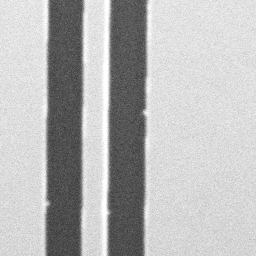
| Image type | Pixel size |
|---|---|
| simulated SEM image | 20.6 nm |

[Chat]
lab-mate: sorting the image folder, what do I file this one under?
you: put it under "lines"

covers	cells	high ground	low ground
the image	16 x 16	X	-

XXX--XX--XXXXXXX
XXX--XX--XXXXXXX
XXX--XX--XXXXXXX
XXX--XX--XXXXXXX
XXX--XX--XXXXXXX
XXX--XX--XXXXXXX
XXX--XX--XXXXXXX
XXX--XX--XXXXXXX
XXX--XX--XXXXXXX
XXX--XX--XXXXXXX
XXX--XX--XXXXXXX
XXX--XX--XXXXXXX
XXX--XX--XXXXXXX
XXX--XX--XXXXXXX
XXX--XX--XXXXXXX
XXX--XX--XXXXXXX